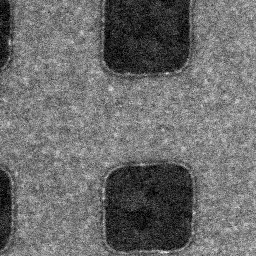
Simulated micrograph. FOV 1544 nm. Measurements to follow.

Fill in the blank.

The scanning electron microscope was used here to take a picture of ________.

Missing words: raised bodies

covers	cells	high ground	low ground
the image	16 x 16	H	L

HLLLLLHHHHHHLLLL
HLLLLLHHHHHHLLLL
HLLLLLHHHHHHLLLL
HLLLLLHHHHHHLLLL
LLLLLLLHHHHLLLLL
LLLLLLLLLLLLLLLL
LLLLLLLLLLLLLLLL
LLLLLLLLLLLLLLLL
LLLLLLLLLLLLLLLL
LLLLLLLLLLLLLLLL
LLLLLLLHHHHHLLLL
HLLLLLLHHHHHLLLL
HLLLLLHHHHHHLLLL
HLLLLLLHHHHHLLLL
HLLLLLLHHHHHLLLL
LLLLLLLHHHHLLLLL